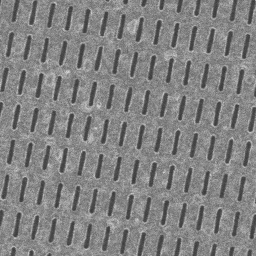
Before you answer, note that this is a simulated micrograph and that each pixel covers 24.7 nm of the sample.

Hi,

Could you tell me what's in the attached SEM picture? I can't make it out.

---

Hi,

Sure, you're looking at a regular array of holes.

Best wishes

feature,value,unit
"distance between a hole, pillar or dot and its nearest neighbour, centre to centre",0.442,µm